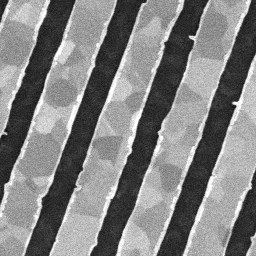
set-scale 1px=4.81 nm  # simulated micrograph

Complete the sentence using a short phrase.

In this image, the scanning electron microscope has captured one or a few lines or trenches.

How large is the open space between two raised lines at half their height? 118 nm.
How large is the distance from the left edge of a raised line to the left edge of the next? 62.5 pixels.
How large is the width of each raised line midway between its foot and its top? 183 nm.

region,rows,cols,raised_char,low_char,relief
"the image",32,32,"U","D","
DUUUUUDDDUUUUUDDDDUUUUUDDDUUUUUD
DUUUUUDDDUUUUUDDDUUUUUUDDUUUUUUD
UUUUUDDDDUUUUUDDDUUUUUDDDUUUUUDD
UUUUUDDDUUUUUDDDDUUUUDDDDUUUUUDD
UUUUUDDDUUUUUDDDUUUUUDDDUUUUUDDD
UUUUDDDDUUUUUDDDUUUUUDDDUUUUUDDD
UUUUDDDUUUUUDDDDUUUUDDDDUUUUUDDD
UUUUDDDUUUUUDDDUUUUUDDDDUUUUDDDD
UUUDDDUUUUUUDDDUUUUUDDDUUUUUDDDU
UUUDDDUUUUUDDDUUUUUDDDDUUUUUDDDU
UUUDDDUUUUUDDDUUUUUDDDDUUUUDDDDU
UUDDDUUUUUDDDDUUUUUDDDUUUUUDDDUU
UUDDDUUUUUDDDUUUUUDDDDUUUUDDDDUU
UDDDDUUUUUDDDUUUUUDDDDUUUUDDDDUU
UDDDUUUUUDDDDUUUUDDDDUUUUUDDDUUU
UDDDUUUUUDDDUUUUUDDDUUUUUUDDDUUU
DDDDUUUUUDDDUUUUUDDDUUUUUDDDUUUU
DDDUUUUUDDDDUUUUUDDDUUUUUDDDUUUU
DDDUUUUUDDDUUUUUDDDUUUUUDDDDUUUU
DDUUUUUUDDDUUUUUDDDUUUUUDDDUUUUU
DDUUUUUDDDUUUUUUDDDUUUUUDDDUUUUU
DDUUUUUDDDUUUUUDDDUUUUUDDDDUUUUU
DUUUUUUDDDUUUUUDDDUUUUUDDDUUUUUD
DUUUUUDDDUUUUUDDDDUUUUUDDDUUUUUD
DUUUUUDDDUUUUUDDDUUUUUDDDDUUUUUD
UUUUUDDDDUUUUUDDDUUUUUDDDUUUUUDD
UUUUUDDDUUUUUDDDDUUUUUDDDUUUUUDD
UUUUUDDDUUUUUDDDUUUUUDDDUUUUUDDD
UUUUDDDUUUUUUDDDUUUUUDDDUUUUUDDD
UUUUDDDUUUUUDDDUUUUUUDDDUUUUUDDD
UUUDDDDUUUUUDDDUUUUUDDDUUUUUDDDU
UUUDDDUUUUUDDDDUUUUUDDDUUUUUDDDU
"